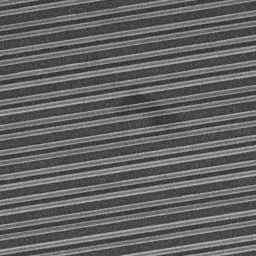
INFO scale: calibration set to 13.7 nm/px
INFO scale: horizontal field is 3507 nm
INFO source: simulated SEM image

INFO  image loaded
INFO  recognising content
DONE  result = parallel lines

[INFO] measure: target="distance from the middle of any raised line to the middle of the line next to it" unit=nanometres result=168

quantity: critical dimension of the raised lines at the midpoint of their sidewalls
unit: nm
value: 54.2